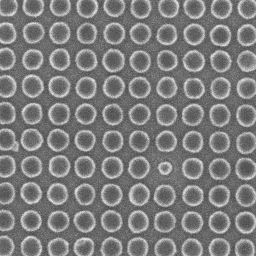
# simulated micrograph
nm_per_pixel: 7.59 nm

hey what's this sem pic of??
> a regular array of raised bodies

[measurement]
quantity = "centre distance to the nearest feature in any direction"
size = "200 nm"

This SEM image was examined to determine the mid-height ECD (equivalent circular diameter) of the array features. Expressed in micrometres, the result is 0.158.